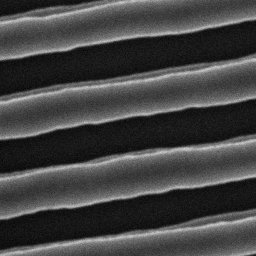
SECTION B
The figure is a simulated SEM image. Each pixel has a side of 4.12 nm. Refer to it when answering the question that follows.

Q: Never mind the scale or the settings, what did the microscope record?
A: lines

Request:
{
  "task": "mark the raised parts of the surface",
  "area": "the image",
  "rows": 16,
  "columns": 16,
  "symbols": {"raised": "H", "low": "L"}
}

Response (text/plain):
LLLHHHHHHHHHHHHH
HHHHHHHHHHHHHHLL
HHHHHHHLLLLLLLLL
HHLLLLLLLLLLLLLL
LLLLLLLLLLHHHHHH
LLLHHHHHHHHHHHHH
HHHHHHHHHHHHHHLL
HHHHHHHLLLLLLLLL
HHLLLLLLLLLLLLLH
LLLLLLLLLHHHHHHH
LLLHHHHHHHHHHHHH
HHHHHHHHHHHHHHLL
HHHHHHHLLLLLLLLL
HLLLLLLLLLLLLHHH
LLLLLLLLHHHHHHHH
LHHHHHHHHHHHHHHH